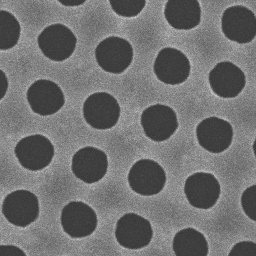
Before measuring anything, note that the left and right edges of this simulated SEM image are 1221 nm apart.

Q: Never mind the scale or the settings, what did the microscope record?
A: a regular array of holes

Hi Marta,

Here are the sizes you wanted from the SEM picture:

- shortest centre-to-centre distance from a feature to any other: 268 nm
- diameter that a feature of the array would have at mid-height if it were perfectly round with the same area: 0.177 um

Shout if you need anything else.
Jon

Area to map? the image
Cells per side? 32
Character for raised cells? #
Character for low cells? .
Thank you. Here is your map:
########..####....###....#######
.#############....###....###....
..###################....###....
...###...#############..####....
..###....###################....
..###.....##....################
#####....###.....###...#########
######..####.....##.....########
#############...###.....###...##
.###################....##.....#
.###...##############.####.....#
.##.....###################...##
###.....###...##################
####....##.....###...###########
##########.....###....##########
###########...####....###....###
##################....###....###
###...#############..####....###
##.....###..#############...####
##.....##....###################
###...###....####...############
#########....###.....###########
##########..####.....##....#####
################....###.....###.
#....##################....###..
.....###...#############...###..
.....###....###################.
#...####....###...##############
########....##.....####.########
#########..###.....###...#######
###############....###....####..
...###################....###...